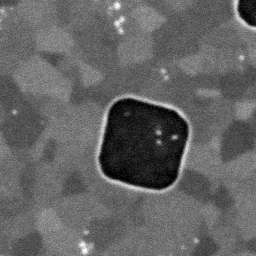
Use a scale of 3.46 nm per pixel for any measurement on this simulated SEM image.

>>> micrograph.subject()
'holes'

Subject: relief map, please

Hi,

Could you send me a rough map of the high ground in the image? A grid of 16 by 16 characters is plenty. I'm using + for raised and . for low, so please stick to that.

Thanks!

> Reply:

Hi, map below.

+++++++++++++++.
+++++++++++++++.
++++++++++++++++
++++++++++++++++
++++++++++++++++
++++++++++++++++
+++++++...++++++
+++++++.....++++
++++++......++++
++++++......++++
++++++.....+++++
++++++++...+++++
++++++++++++++++
++++++++++++++++
++++++++++++++++
++++++++++++++++